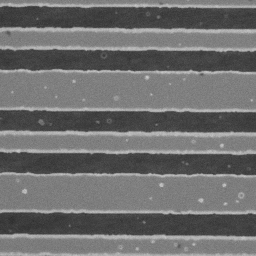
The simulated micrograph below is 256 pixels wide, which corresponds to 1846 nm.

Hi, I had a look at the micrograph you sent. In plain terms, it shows lines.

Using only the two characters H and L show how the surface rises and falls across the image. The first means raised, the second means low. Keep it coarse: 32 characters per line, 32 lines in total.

HHHHHHHHHHHHHHHHHHHHHHHHHHHHHHHH
LLLLLLLLLLLLLLLLLLLLLLLLLLLLLLLL
LLLLLLLLLLLLLLLLLLLLLLLLLLLLLLLL
LLLLLLLLLLLLLLLLLLLLLLLLLLLLLLLL
HHHHHHHHHHHHHHHHHHHHHHHHHHHHHHHH
HHHHHHHHHHHHHHHHHHHHHHHHHHHHHHHH
LLLLLLLLLLLLLLLLLLLLLLLLLLLLLLLL
LLLLLLLLLLLLLLLLLLLLLLLLLLLLLLLL
LLLLLLLLLLLLLLLLLLLLLLLLLLLLLLLL
HHHHHHHHHHHHHHHHHHHHHHHHHHHHHHHH
HHHHHHHHHHHHHHHHHHHHHHHHHHHHHHHH
HHHHHHHHHHHHHHHHHHHHHHHHHHHHHHHH
HHHHHHHHHHHHHHHHHHHHHHHHHHHHHHHH
HHHHHHHHHHHHHHHHHHHHHHHHHHHHHHHH
LLLLLLLLLLLLLLLLLLLLLLLLLLLLLLLL
LLLLLLLLLLLLLLLLLLLLLLLLLLLLLLLL
HHHHLLHLHHLLLLLLLLLLLLLLLLLLLLLL
HHHHHHHHHHHHHHHHHHHHHHHHHHHHHHHH
HHHHHHHHHHHHHHHHHHHHHHHHHHHHHHHH
LLLLLLLLLLLLLLLLLLLLLLLLLLLLLLLL
LLLLLLLLLLLLLLLLLLLLLLLLLLLLLLLL
LLLLLLLLLLLLLLLLLLLLLLLLLLLLLLLL
HHHHHHHHHHHHHHHHHHHHHHHHHHHHHHHH
HHHHHHHHHHHHHHHHHHHHHHHHHHHHHHHH
HHHHHHHHHHHHHHHHHHHHHHHHHHHHHHHH
HHHHHHHHHHHHHHHHHHHHHHHHHHHHHHHH
LLLLLHHLLHHHHHHHHHHHHHHHHHHHHHHH
LLLLLLLLLLLLLLLLLLLLLLLLLLLLLLLL
LLLLLLLLLLLLLLLLLLLLLLLLLLLLLLLL
LHHHLLLLLLLLLLLLLLLLLLLLLLLLLLLL
HHHHHHHHHHHHHHHHHHHHHHHHHHHHHHHH
HHHHHHHHHHHHHHHHHHHHHHHHHHHHHHHH